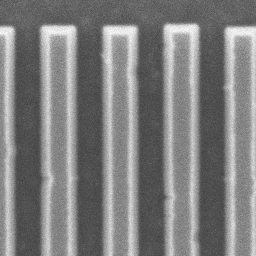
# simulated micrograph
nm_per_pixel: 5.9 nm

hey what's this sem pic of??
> one or a few lines or trenches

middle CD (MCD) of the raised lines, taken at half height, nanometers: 161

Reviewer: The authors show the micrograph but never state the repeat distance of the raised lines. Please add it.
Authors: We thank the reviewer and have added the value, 362 nm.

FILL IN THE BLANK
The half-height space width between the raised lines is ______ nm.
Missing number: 201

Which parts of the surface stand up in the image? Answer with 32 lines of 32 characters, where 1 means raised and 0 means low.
00000000000000000000000000000000
00000000000000000000000000000000
00000000000000000000000000000000
00000000000000000000000000000000
10000011100001111000011100000111
10000011100001111000011100000111
10000011100001111000011100000111
10000011100001111000011100000111
10000011100001111000011100000111
10000011100001111000011100000111
10000011100001111000011100000111
10000011100001111000011100000111
10000011100001111000011100000111
10000011100001111000011100000111
10000011100001111000011100000111
10000011100001111000011100000111
10000011100001111000011100000111
10000011100001111000011100000111
10000011100001111000011100000111
10000011100001111000011100000111
10000011100001111000011100000111
10000011100001111000011100000111
10000011100001111000011100000111
10000011100001111000011100000111
10000011100001111000011100000111
10000011100001111000011100000111
10000011100001111000011100000111
10000011100001111000011100000111
10000011100001111000011100000111
10000011100001111000011100000111
10000011100001111000011100000111
10000011100001111000011100000111